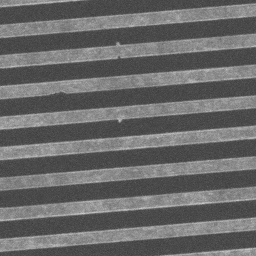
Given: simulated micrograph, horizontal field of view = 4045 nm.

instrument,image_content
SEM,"parallel lines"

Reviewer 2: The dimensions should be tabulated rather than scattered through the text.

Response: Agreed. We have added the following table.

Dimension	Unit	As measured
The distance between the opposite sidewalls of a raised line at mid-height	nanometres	189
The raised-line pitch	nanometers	481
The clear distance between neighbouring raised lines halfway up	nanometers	297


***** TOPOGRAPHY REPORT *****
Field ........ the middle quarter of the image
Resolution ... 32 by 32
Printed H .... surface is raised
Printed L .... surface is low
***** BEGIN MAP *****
LLLLLLLLLLLLLLLLLLLLLLLLLLLLLLLL
LLLLLLLLLLLLLLLLLLLLLLLLLLLLLLLL
LLLLLLLLLLLLLLLLLLLLLLLHHHHHHHHH
LLLLLLLLLLLHHHHHHHHHHHHHHHHHHHHH
HHHHHHHHHHHHHHHHHHHHHHHHHHHHHHHH
HHHHHHHHHHHHHHHHHHHHHLLLLLLLLLLL
HHHHHHHHHLLLLLLLLLLLLLLLLLLLLLLL
LLLLLLLLLLLLLLLLLLLLLLLLLLLLLLLL
LLLLLLLLLLLLLLLLLLLLLLLLLLLLLLLL
LLLLLLLLLLLLLLLLLLLLLLLLLLLLLHHH
LLLLLLLLLLLLLLLLLHHHHHHHHHHHHHHH
LLLLLLLLHHHHHHHHHHHHHHHHHHHHHHHH
HHHHHHHHHHHHHHHHHHHHHHHHHHHLHLLL
HHHHHHHHHHHHHHHLLLLLLLLLLLLLLLLL
HHHLLLLLLLLLLLLLLLLLLLLLLLLLLLLL
LLLLLLLLLLLLLLLLLLLLLLLLLLLLLLLL
LLLLLLLLLLLLLLLLLLLLLLLLLLLLLLLL
LLLLLLLLLLLLLLLLLLLLLLLLLLHHHHHH
LLLLLLLLLLLLLLHHHHHHHHHHHHHHHHHH
LLHHHHHHHHHHHHHHHHHHHHHHHHHHHHHH
HHHHHHHHHHHHHHHHHHHHHHHHLLLLLLLL
HHHHHHHHHHHHLLLLLLLLLLLLLLLLLLLL
LLLLLLLLLLLLLLLLLLLLLLLLLLLLLLLL
LLLLLLLLLLLLLLLLLLLLLLLLLLLLLLLL
LLLLLLLLLLLLLLLLLLLLLLLLLLLLLLLL
LLLLLLLLLLLLLLLLLLLLHHHHHHHHHHHH
LLLLLLLLHHHHHHHHHHHHHHHHHHHHHHHH
HHHHHHHHHHHHHHHHHHHHHHHHHHHHHHLL
HHHHHHHHHHHHHHHHHHLLLLLLLLLLLLLL
HHHHHHLLLLLLLLLLLLLLLLLLLLLLLLLL
LLLLLLLLLLLLLLLLLLLLLLLLLLLLLLLL
LLLLLLLLLLLLLLLLLLLLLLLLLLLLLLLL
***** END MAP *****